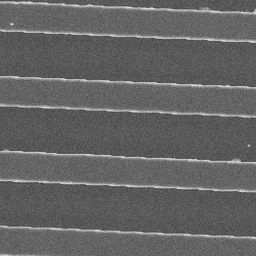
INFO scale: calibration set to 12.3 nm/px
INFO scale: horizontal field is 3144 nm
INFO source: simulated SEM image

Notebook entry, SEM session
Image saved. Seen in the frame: lines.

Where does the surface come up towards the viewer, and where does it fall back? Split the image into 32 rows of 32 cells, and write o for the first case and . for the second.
oooooo..........................
ooooooooooooooooooooooooooo.....
oooooooooooooooooooooooooooooooo
oooooooooooooooooooooooooooooooo
.............ooooooooooooooooooo
................................
................................
................................
................................
................................
ooooooooooooooooooooooo.........
oooooooooooooooooooooooooooooooo
oooooooooooooooooooooooooooooooo
........oooooooooooooooooooooooo
..............................oo
................................
................................
................................
................................
oooooooooooooo..................
oooooooooooooooooooooooooooooooo
oooooooooooooooooooooooooooooooo
oooooooooooooooooooooooooooooooo
......................oooooooooo
................................
................................
................................
................................
oooo............................
ooooooooooooooooooooooooooo.....
oooooooooooooooooooooooooooooooo
oooooooooooooooooooooooooooooooo